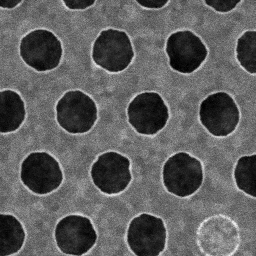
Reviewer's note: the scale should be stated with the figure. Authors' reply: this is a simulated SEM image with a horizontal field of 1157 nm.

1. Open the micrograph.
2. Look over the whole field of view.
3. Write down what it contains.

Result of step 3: a regular array of holes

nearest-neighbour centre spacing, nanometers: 317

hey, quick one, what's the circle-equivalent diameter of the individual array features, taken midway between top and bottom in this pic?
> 191 nanometres